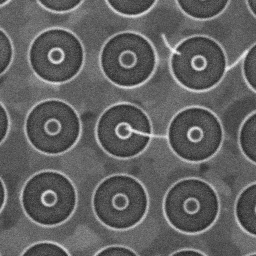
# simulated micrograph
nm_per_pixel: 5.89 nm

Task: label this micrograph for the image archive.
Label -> an array of small figures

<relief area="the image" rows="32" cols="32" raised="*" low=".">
*****.....****.....***......***.
*******.*******...*****.....****
********************************
********************************
.****....*****....**************
.***......***......***.....*****
..**..**..***......***......***.
.***..**..***..**...*...**..**..
.***......***......**...*...**..
*****....****......***......***.
**************....*****....****.
********************************
********************************
****.....*****...*******.*******
.***......***.....****.....****.
.**...*...**...*...**.......**..
.**...*...**...*...**...*...**..
****......**.......**...*...**..
****.....****.....***......***..
**************...*****....*****.
********************************
*****..*************************
****.....****....******..*******
.**......***......***.....*****.
.**..**..***...*..***......***..
***...*..***..**...**..**..***..
***......***......***......**...
****....*****.....***......***..
**************..******....****..
********************************
*****..*************************
***.....****.....*****...*******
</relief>